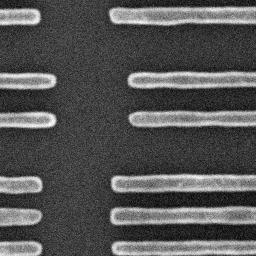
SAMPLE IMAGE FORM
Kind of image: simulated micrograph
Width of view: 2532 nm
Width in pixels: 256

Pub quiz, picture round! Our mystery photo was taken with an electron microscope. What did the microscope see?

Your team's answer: wiring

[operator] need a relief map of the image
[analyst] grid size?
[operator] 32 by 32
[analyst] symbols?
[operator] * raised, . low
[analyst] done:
................................
****..........******************
*****.........******************
................................
................................
................................
................................
................................
................................
******...........***************
******...........***************
................................
................................
................................
******...........***************
******...........****.***...****
................................
................................
................................
................................
................................
................................
*****.........******************
*****.........******************
................................
................................
***...........******************
****..........******************
................................
................................
****...........*****************
*****..........*****************